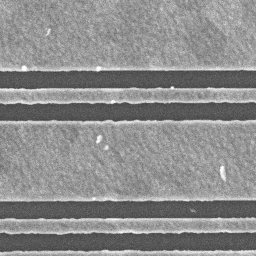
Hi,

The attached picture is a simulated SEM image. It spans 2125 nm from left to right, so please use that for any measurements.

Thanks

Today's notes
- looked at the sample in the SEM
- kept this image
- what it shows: lines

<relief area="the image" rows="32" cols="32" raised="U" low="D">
UUUUUUUUUUUUUUUUUUUUUUUUUUUUUUUU
UUUUUUUUUUUUUUUUUUUUUUUUUUUUUUUU
UUUUUUUUUUUUUUUUUUUUUUUUUUUUUUUU
UUUUUUUUUUUUUUUUUUUUUUUUUUUUUUUU
UUUUUUUUUUUUUUUUUUUUUUUUUUUUUUUU
UUUUUUUUUUUUUUUUUUUUUUUUUUUUUUUU
UUUUUUUUUUUUUUUUUUUUUUUUUUUUUUUU
UUUUUUUUUUUUUUUUUUUUUUUUUUUUUUUU
UUUUUUUUUUUUUUUUUUUUUUUUUUUUUUUU
DDDDDDDDDDDDDDDDDDDDDDDDDDDDDDDD
DDDDDDDDDDDDDDDDDDDDDDDDDDDDDDDD
UUUUUUUUUUUUUUUUUUUUUUUUUUUUUUUU
UUUUUUUUUUUUUUUUUUUUUUUUUUUUUUUU
DDDDDDDDDDDDDDDDDDDDDDDDDDDDDDDD
DDDDDDDDDDDDDDDDDDDDDDDDDDDDDDDD
UUUUUUUUUUUUUUUUUUUUUUUUUUUUUUUU
UUUUUUUUUUUUUUUUUUUUUUUUUUUUUUUU
UUUUUUUUUUUUUUUUUUUUUUUUUUUUUUUU
UUUUUUUUUUUUUUUUUUUUUUUUUUUUUUUU
UUUUUUUUUUUUUUUUUUUUUUUUUUUUUUUU
UUUUUUUUUUUUUUUUUUUUUUUUUUUUUUUU
UUUUUUUUUUUUUUUUUUUUUUUUUUUUUUUU
UUUUUUUUUUUUUUUUUUUUUUUUUUUUUUUU
UUUUUUUUUUUUUUUUUUUUUUUUUUUUUUUU
UUUUUUUUUUUUUUUUUUUUUUUUUUUUUUUU
DDDDDDDDDDDDDDDDDDDDDDDDDDDDDDDD
DDDDDDDDDDDDDDDDDDDDDDDDDDDDDDDD
UUUUUUUUUUUUUUUUUUUUUUUUUUUUUUUU
UUUUUUUUUUUUUUUUUUUUUUUUUUUUUUUU
DDDDDDDDDDDDDDDDDDDDDDDDDDDDDDDD
DDDDDDDDDDDDDDDDDDDDDDDDDDDDDDDD
DUUUUUUUUUUUUUUUUUUUUUUUUUUUUUUU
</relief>